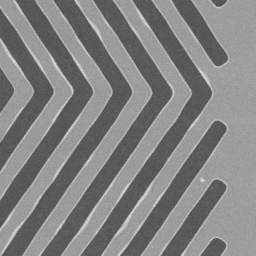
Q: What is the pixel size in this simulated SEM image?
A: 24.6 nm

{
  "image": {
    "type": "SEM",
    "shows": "groups of lines, slits or small figures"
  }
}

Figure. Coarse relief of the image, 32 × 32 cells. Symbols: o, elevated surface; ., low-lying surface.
oo...oo...oo..ooo..ooo..ooo.oooo
ooo..ooo..ooo..oo...oo...ooooooo
.oo...oo...oo...oo...oo...oooooo
..oo...oo...oo...oo..ooo..oooooo
..ooo..ooo..ooo..oo...oo...ooooo
...oo...oo...oo...oo...oo..ooooo
o...oo...oo..ooo..ooo..ooo..oooo
oo...oo..ooo..ooo..oo...oo..oooo
oo...oo...oo...oo...oo...ooooooo
.oo...oo...oo..ooo..ooo..ooooooo
.ooo..ooo..ooo..oo...oo...oooooo
..oo...oo...oo...oo...oo...ooooo
.ooo..ooo..ooo..ooo..ooo..oooooo
.oo...oo...oo..ooo..ooo...oooooo
oo...oo...oo...oo...oo...ooooooo
oo..ooo..ooo..oo...ooo..oo..oooo
o..ooo..ooo..ooo..ooo..ooo..oooo
...oo...oo...oo...oo...oo...oooo
..oo...oo...oo...oo...oo...ooooo
.ooo..ooo..ooo..ooo..ooo..oooooo
.oo...oo...oo...oo...oo...oooooo
oo...oo...oo...oo...oo...ooooooo
oo..ooo..ooo..ooo..ooo..oooooooo
o...oo...oo...oo...oo..ooo..oooo
...oo...oo...oo...oo...oo...oooo
..ooo..ooo..ooo..oo...oo...ooooo
..oo..ooo...oo...oo..ooo..oooooo
.oo...oo...oo...oo...oo...oooooo
oo...oo...ooo..oo...oo...ooooooo
oo..ooo..ooo..ooo..ooo..oooooooo
o...oo...oo...oo...oo...oo..oooo
...oo...oo...oo...oo...oo...oooo